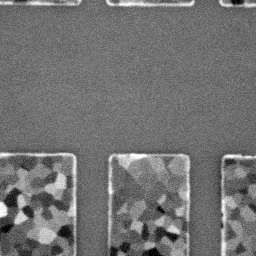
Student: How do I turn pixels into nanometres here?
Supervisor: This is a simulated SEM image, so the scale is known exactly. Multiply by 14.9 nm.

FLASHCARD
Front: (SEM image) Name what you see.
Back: wiring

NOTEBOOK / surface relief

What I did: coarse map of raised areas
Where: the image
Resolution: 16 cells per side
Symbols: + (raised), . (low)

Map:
................
................
................
................
................
................
................
................
................
................
+++++..+++++..++
+++++..+++++..++
+++++..+++++..++
+++++..+++++..++
+++++..+++++..++
+++++..+++++..++